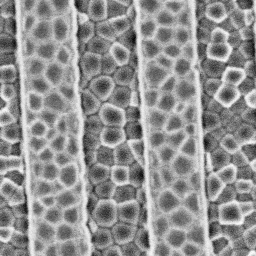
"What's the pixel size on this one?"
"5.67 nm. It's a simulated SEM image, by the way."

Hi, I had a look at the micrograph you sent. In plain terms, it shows one or a few lines or trenches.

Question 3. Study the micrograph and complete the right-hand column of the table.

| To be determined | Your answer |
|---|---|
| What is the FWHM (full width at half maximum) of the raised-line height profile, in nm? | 317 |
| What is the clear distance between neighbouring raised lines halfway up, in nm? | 363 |